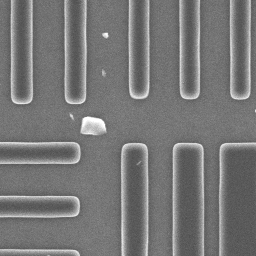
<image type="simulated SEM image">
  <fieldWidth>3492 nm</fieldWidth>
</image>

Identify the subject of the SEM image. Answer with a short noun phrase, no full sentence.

groups of lines, slits or small figures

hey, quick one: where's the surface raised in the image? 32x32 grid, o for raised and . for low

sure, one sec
.ooo....ooo.....ooo...ooo....oo.
.ooo....ooo.....ooo...ooo....oo.
.ooo....ooo.....ooo...ooo....oo.
.ooo....ooo.....ooo....oo....oo.
.ooo....ooo.....ooo....oo....oo.
.ooo....ooo.....ooo....oo....oo.
.ooo....ooo.....ooo....oo....oo.
.ooo....ooo.....ooo....oo....oo.
.ooo....ooo.....ooo....oo....oo.
.ooo....ooo.....ooo....oo....oo.
.ooo....ooo.....ooo....oo....oo.
.ooo....ooo.....oo.....oo....oo.
..oo....oo......................
................................
................................
..........ooo...................
...........o....................
................................
oooooooooo.....ooo....ooo...oooo
oooooooooo.....ooo....ooo...oooo
...............ooo....ooo...oooo
...............ooo....ooo...oooo
...............ooo....ooo...oooo
...............ooo....ooo...oooo
...............ooo....ooo...oooo
oooooooooo.....ooo....ooo...oooo
oooooooooo.....ooo....ooo...oooo
...............ooo....ooo...oooo
...............ooo....ooo...oooo
...............ooo....ooo...oooo
...............ooo....ooo...oooo
oooooooooo.....ooo....ooo...oooo